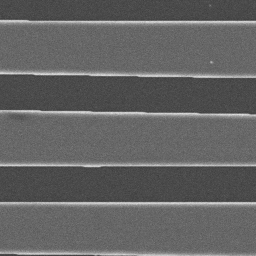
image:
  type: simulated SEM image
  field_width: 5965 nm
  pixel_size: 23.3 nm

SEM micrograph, lines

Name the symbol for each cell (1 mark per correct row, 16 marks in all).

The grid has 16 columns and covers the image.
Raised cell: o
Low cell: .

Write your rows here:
................
oooooooooooooooo
oooooooooooooooo
oooooooooooooooo
oooooooooooooooo
................
................
oooooooooooooooo
oooooooooooooooo
oooooooooooooooo
................
................
................
oooooooooooooooo
oooooooooooooooo
oooooooooooooooo